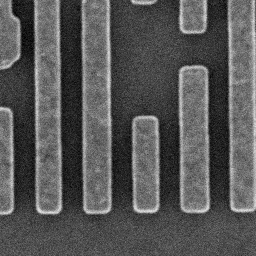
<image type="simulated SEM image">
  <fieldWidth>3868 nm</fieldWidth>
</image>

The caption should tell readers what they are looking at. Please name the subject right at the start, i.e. wiring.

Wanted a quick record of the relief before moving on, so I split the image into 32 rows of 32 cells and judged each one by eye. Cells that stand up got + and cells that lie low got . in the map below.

+...+++...++++.........+++...+++
+...+++...++++.........+++...+++
++..+++...++++.........+++...+++
++..+++...++++.........+++...+++
++..+++...++++...............+++
++..+++...++++...............+++
++..+++...++++...............+++
++..+++...++++...............+++
+...+++...++++.........+++...+++
....+++...++++.........+++...+++
....+++...++++.........+++...+++
.....++...++++.........+++...+++
.....++...++++.........+++...+++
.....++...++++.........+++...+++
+....++...++++.........+++...+++
+....++...++++...+++...+++...+++
+....++...++++...+++...+++...+++
++...+++..++++...+++...+++...+++
++...+++..++++...+++...+++...+++
++...+++..++++...+++...+++...+++
++...+++..++++...+++...+++...+++
++...+++..++++...+++...+++...+++
++...+++..++++...+++...+++...+++
++...+++...+++...+++...+++...+++
++...+++...+++...+++...+++...+++
++...+++...+++...+++...+++...+++
+....++....++...................
................................
................................
................................
................................
................................